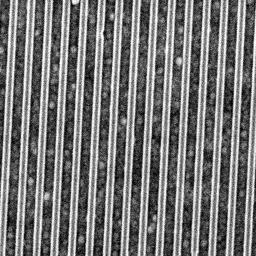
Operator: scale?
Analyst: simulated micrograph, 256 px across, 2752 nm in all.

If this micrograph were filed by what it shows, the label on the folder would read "parallel lines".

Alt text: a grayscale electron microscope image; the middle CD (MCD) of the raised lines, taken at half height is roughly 68.5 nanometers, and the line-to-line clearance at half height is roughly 121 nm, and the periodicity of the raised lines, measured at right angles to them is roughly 189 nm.